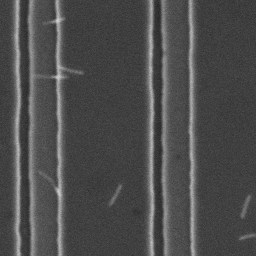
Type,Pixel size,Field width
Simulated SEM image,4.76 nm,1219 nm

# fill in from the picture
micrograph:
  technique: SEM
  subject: lines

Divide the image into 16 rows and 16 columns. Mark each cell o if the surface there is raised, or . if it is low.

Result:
o...oooooo..oooo
o...oooooo..oooo
o...ooooo...oooo
o...ooooo...oooo
o...ooooo...oooo
o...oooooo..oooo
o...oooooo..oooo
o...oooooo..oooo
o...oooooo..oooo
o...oooooo..oooo
o...oooooo..oooo
o...oooooo..oooo
o...oooooo..oooo
o...oooooo..oooo
o...oooooo..oooo
o...oooooo..oooo